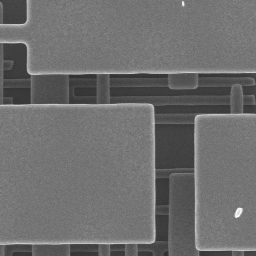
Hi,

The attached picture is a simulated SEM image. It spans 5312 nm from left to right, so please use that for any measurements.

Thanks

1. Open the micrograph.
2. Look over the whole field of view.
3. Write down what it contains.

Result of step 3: wiring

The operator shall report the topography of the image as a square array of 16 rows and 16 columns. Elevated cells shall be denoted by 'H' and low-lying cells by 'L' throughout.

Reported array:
LLHHHHHHHHHHHHHH
LHHHHHHHHHHHHHHH
HHHHHHHHHHHHHHHH
LLHHHHHHHHHHHHHH
LLHHHHHHHHHHHHHH
LLLLLLLLLLLLLLLL
LLLLLLLHHLLLLLLL
HHHHHHHHHHLLHHHH
HHHHHHHHHHLLHHHH
HHHHHHHHHHLLHHHH
HHHHHHHHHHLLHHHH
HHHHHHHHHHLLHHHH
HHHHHHHHHHLLHHHH
HHHHHHHHHHLLHHHH
HHHHHHHHHHLLHHHH
LLLLLLLLLLLLHHHH